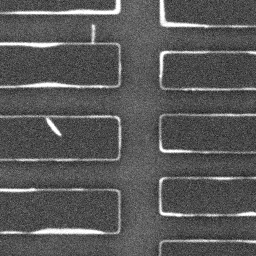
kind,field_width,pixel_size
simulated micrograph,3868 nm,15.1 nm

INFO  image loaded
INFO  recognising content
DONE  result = groups of lines, slits or small figures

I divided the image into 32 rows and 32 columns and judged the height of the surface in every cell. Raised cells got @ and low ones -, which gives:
@@@@@@@@@@@@@@@-----@@@@@@@@@@@@
@@@@@@@@@---@@------@@@@@@@@@@@@
--------------------@@@@@@@@@@@@
--------------------------------
--------------------------------
-@-----@@@@@@@@-----------------
@@@@@@@@@@@@@@@-----------------
@@@@@@@@@@@@@@@-----@@@@@@@@@@@@
@@@@@@@@@@@@@@@-----@@@@@@@@@@@@
@@@@@@@@@@@@@@@-----@@@@@@@@@@@@
@@@@@@@@@@@@@@@-----@@@@@@@@@@@@
--------------------------------
--------------------------------
--------------------------------
--------------------@@@@@@@@@@@@
@@@@@@@@@@@@@@@-----@@@@@@@@@@@@
@@@@@@@@@@@@@@@-----@@@@@@@@@@@@
@@@@@@@@@@@@@@@-----@@@@@@@@@@@@
@@@@@@@@@@@@@@@-----@@@@@@@@@@@@
@@@@@@@@@@@@@@@-----------------
--------------------------------
--------------------------------
--------------------@@@@@@@@@@@@
--------------------@@@@@@@@@@@@
@@@@@@@@@@@@@@@-----@@@@@@@@@@@@
@@@@@@@@@@@@@@@-----@@@@@@@@@@@@
@@@@@@@@@@@@@@@-----@@@@@@@@@@@@
@@@@@@@@@@@@@@@-----------------
@@@@@@@@@@@@@@@-----------------
--------------------------------
--------------------@@@@@@@@@@@@
--------------------@@@@@@@@@@@@